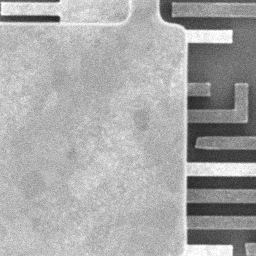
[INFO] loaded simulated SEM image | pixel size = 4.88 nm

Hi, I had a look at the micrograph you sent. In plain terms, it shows wiring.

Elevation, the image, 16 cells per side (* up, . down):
........**......
*****..****.....
************....
************....
************....
************....
************....
************....
************....
************....
************....
************....
************....
************....
************....
************....